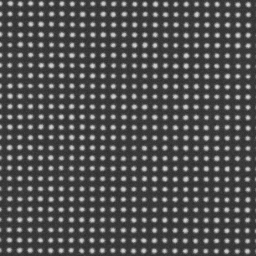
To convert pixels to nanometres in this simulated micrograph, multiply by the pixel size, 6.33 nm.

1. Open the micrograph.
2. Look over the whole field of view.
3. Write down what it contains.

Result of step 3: a regular array of raised bodies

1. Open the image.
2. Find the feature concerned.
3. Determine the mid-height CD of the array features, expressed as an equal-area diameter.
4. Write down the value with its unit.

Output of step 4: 0.0295 micrometres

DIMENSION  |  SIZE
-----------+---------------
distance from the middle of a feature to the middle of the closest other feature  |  62.2 nanometres